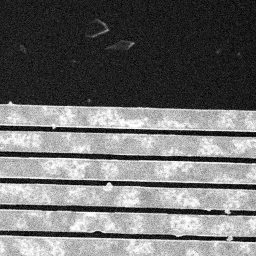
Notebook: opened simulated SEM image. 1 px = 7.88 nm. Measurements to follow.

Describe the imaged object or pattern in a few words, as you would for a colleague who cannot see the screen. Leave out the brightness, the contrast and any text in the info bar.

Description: parallel lines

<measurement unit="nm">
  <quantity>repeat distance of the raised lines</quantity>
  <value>208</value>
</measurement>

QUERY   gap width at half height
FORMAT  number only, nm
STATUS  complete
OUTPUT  50.2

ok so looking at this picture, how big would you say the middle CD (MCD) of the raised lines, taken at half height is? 159 nm